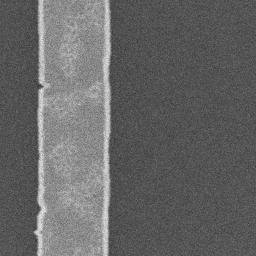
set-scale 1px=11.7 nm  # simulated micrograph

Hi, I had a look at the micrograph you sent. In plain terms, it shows one or a few lines or trenches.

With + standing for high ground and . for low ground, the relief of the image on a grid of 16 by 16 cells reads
...++++.........
...++++.........
...++++.........
...++++.........
...++++.........
...++++.........
...++++.........
...++++.........
...++++.........
...++++.........
...++++.........
...++++.........
...++++.........
...++++.........
..+++++.........
...++++.........